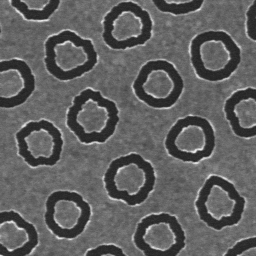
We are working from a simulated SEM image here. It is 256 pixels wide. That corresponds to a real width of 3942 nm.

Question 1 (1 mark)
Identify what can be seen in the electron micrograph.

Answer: a regular array of ring-shaped grooves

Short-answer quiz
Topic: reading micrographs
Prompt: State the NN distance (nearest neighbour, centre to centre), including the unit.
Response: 993 nanometres